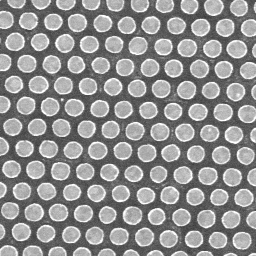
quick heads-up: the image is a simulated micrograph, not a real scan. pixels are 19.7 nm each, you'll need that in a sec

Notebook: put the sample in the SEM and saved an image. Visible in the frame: a regular array of raised bodies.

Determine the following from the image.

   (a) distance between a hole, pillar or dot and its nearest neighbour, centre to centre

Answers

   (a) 472 nanometers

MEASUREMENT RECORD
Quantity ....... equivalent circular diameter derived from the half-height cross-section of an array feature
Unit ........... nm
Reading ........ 338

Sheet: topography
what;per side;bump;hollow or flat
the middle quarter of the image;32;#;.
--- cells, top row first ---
.####..####..####..#####.####...
..###...###..####..#####.####...
..............##....###...###...
#...............................
##..####...###...##....###....#.
##..####..####..####..####...###
##..####..####..####..####..####
.....#.....##....###...###...###
..............................##
.###....##....##................
#####..####..####..####...###...
#####..####..####..####..####..#
.###...####..####..####..####..#
..........................##....
#....#.....#....................
#...####..####..####..####...###
##..####..####..####..####..####
#...###...####..####..####..####
................###...###....###
................................
.###...###...####...##....##....
####..#####..####..####..####..#
####..####...####..####.#####..#
..#....###....##...####..###...#
................................
#...###...###...................
#..####..####..####...###...###.
#..####..####..#####..####..####
....###...###...###...###...####
.......................#.....##.
.##....##.......................
####..####..####...###...###....